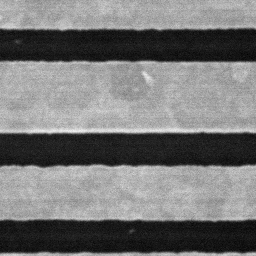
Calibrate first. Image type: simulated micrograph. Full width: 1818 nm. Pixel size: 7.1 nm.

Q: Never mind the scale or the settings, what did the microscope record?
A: lines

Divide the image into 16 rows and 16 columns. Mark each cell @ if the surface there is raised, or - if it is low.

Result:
@@@@@@@@@@@@@@@@
@@@@@@@@@@@@@@@@
----------------
----------------
@@@@@@@@@@@@@@@@
@@@@@@@@@@@@@@@@
@@@@@@@@@@@@@@@@
@@@@@@@@@@@@@@@@
----------------
----------------
@@@@@@@@@@@@@@@@
@@@@@@@@@@@@@@@@
@@@@@@@@@@@@@@@@
@@@@@@@@@@@@@@@@
----------------
----------------